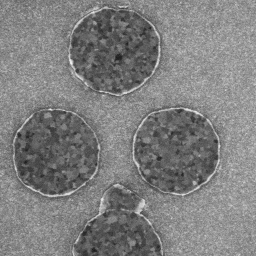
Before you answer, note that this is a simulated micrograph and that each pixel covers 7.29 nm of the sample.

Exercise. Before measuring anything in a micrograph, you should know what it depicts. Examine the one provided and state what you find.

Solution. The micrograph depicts raised bodies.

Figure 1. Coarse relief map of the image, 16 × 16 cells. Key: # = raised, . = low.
................
.....####.......
....######......
....######......
.....#####......
......###.......
................
..###....####...
.#####..######..
.#####..######..
.#####...#####..
..###....####...
......###.......
......###.......
.....#####......
.....#####......